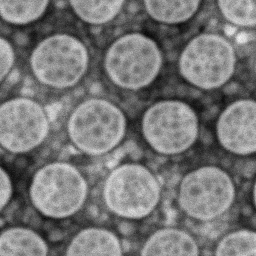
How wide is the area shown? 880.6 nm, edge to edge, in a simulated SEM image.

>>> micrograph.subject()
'a regular array of raised bodies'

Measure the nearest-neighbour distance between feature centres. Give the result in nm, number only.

253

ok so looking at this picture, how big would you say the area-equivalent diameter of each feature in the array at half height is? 177 nanometres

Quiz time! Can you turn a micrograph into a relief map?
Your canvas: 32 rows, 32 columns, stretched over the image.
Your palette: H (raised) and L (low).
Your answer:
HHHHHHLLLHHHHHHLLLHHHHHHHLLLHHHH
HHHHHLLLLLHHHHHLLLLHHHHHLLLLHHHH
LHHHLLLLLLLHHLLLLLLLHHHLLLLLLHHH
LLLLLLLLLLLLLLLLLLLLLLLLLLLLLLLL
LLLLLLLHLLLLLLLLLLLLLLLLLLLLLLLL
HLLLLHHHHHLLLLHHHHHLLLLLHHHHLLLL
HLLLHHHHHHHLLLHHHHHHLLLHHHHHHLLL
HLLLHHHHHHHLLHHHHHHHLLLHHHHHHLLL
HLLLHHHHHHHLLHHHHHHHLLLHHHHHHLLL
LLLLLHHHHHLLLLHHHHHLLLLHHHHHHLLL
LLLLLLHHHLLLLLLHHHLLLLLLHHHLLLLL
LLLLLLLLLLLLLLLLLLLLLLLLLLLLLLLL
LLLLLLLLLLLLLLLLLLLLLLLLLLLLLLLL
HHHHHLLLLLHHHHLLLLLHHHHHLLLLLHHH
HHHHHLLLLHHHHHHLLLHHHHHHLLLLHHHH
HHHHHHLLLHHHHHHLLLHHHHHHLLLHHHHH
HHHHHHLLLHHHHHHLLLHHHHHHLLLHHHHH
HHHHHLLLLHHHHHHLLLLHHHHHLLLLHHHH
LHHHLLLLLLHHHHLLLLLLHHHLLLLLLHHH
LLLLLLLLLLLLLLLLLLLLLLLLLLLLLLLL
LLLLLLLLLLLLLLLLLLLLLLLLLLLLLLLL
LLLLLHHHHHLLLLHHHHLLLLLLHHHHLLLL
HLLLHHHHHHLLLLHHHHHLLLLHHHHHHLLL
HLLLHHHHHHHLLHHHHHHHLLLHHHHHHLLL
HLLLHHHHHHHLLHHHHHHHLLLHHHHHHLLL
LLLLHHHHHHLLLLHHHHHLLLLHHHHHHLLL
LLLLLLHHHLLLLLLHHHLLLLLLHHHHLLLL
LLLLLLLLLLLLLLLLLLLLLLLLLLLLLLLL
LLLLLLLLLLLLLLLLLLLLLLLLLLLLLLLL
HHHHHLLLLLHHHHLLLLLHHHHLLLLLLHHH
HHHHHLLLLHHHHHHLLLHHHHHHLLLLHHHH
HHHHHHLLLHHHHHHLLLHHHHHHHLLHHHHH